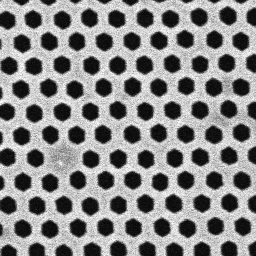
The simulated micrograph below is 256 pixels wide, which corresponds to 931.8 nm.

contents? a regular array of holes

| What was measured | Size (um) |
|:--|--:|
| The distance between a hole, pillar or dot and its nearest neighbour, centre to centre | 0.0939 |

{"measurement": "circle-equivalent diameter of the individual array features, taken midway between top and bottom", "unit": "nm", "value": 64.8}